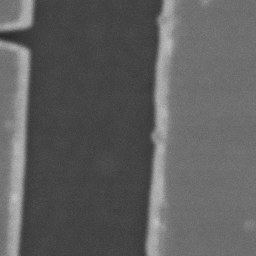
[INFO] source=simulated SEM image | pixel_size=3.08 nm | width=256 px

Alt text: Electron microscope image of one or a few lines or trenches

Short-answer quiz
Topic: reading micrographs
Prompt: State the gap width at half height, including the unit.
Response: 416 nanometres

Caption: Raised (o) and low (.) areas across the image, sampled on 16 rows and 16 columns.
oo........oooooo
oo........oooooo
..........oooooo
oo........oooooo
oo........oooooo
oo........oooooo
o.........oooooo
o.........oooooo
o.........oooooo
o.........oooooo
o.........oooooo
o.........oooooo
o.........oooooo
o........ooooooo
o........ooooooo
o........ooooooo